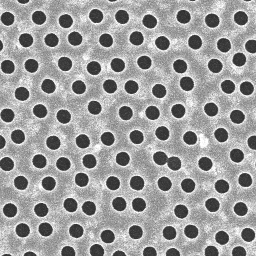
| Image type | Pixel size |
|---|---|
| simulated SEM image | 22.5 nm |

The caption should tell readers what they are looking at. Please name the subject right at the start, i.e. a regular array of holes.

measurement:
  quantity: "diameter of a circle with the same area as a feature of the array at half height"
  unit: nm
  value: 330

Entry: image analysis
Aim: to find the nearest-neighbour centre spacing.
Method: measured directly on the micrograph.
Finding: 535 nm